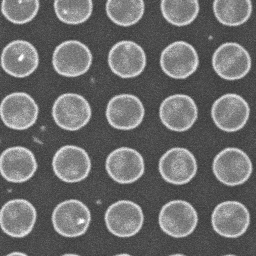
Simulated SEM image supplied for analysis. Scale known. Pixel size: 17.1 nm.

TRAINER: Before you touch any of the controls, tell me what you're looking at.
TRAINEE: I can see a regular array of raised bodies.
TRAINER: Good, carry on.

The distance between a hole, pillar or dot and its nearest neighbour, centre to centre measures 893 nm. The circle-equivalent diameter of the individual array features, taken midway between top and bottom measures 623 nanometres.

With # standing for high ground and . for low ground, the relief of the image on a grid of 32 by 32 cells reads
#####..####..#####..#####..####.
#####..####..#####..#####..####.
.###....###...###....###...####.
................................
................................
.###....##.....##.....#.....#...
####...####...####..####...####.
#####..####...####..#####..####.
####...####...####..####...####.
..#............##....##.....##..
................................
................................
####...####...###....###...###..
#####..####..#####..####...####.
#####..####..#####..####...####.
.###...####...###....###...###..
................................
................................
..#.....##......................
####...####...####..####...####.
####...####..#####..####...####.
####...####...####..####...####.
.##.....##....###....###...####.
................................
................................
.###....##....###....###....##..
####...####..#####..####...####.
####...####..#####..#####..####.
####...####...###...####...####.
..#.....#.............#.....##..
................................
................................